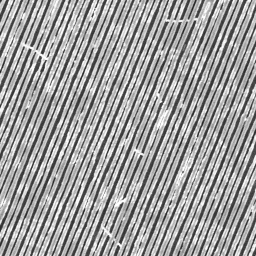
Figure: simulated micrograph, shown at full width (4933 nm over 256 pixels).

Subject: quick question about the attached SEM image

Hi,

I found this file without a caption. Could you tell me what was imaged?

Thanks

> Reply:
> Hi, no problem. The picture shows parallel lines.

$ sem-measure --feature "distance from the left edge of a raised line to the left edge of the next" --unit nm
125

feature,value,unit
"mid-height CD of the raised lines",0.0715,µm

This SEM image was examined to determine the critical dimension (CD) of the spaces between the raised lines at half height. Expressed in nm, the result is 53.7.